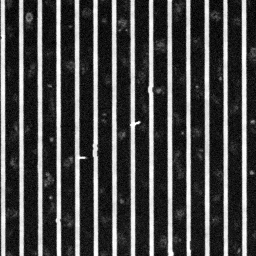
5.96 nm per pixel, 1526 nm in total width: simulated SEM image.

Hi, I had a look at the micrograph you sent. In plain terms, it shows parallel lines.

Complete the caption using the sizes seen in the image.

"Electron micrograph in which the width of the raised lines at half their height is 23.1 nanometers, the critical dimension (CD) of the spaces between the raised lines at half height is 14.4 px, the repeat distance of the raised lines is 0.111 micrometres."